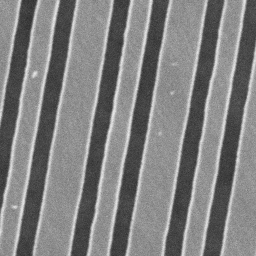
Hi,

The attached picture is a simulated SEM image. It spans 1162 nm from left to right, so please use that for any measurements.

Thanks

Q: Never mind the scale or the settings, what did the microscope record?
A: lines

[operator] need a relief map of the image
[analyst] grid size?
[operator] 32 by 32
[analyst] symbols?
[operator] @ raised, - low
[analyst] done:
@@@--@@---@@@@--@@@--@@@@@--@@@-
@@--@@@--@@@@@--@@@--@@@@@--@@@-
@@--@@@--@@@@@--@@@--@@@@---@@--
@@--@@@--@@@@@--@@@--@@@@--@@@--
@@--@@@--@@@@---@@--@@@@@--@@@--
@@--@@@--@@@@--@@@--@@@@@--@@@--
@---@@---@@@@--@@@--@@@@@--@@@--
@--@@@--@@@@@--@@@--@@@@@--@@---
@--@@@--@@@@@--@@@--@@@@@--@@---
@--@@@--@@@@@--@@---@@@@--@@@--@
@--@@@--@@@@---@@--@@@@@--@@@--@
@--@@---@@@@--@@@--@@@@@--@@@--@
---@@--@@@@@--@@@--@@@@@--@@@--@
--@@@--@@@@@--@@@--@@@@@--@@---@
--@@@--@@@@@--@@@--@@@@---@@--@@
--@@@--@@@@@--@@---@@@@--@@@--@@
--@@@--@@@@---@@--@@@@@--@@@--@@
--@@---@@@@--@@@--@@@@@--@@@--@@
--@@--@@@@@--@@@--@@@@@--@@@--@@
-@@@--@@@@@--@@@--@@@@@--@@---@@
-@@@--@@@@@--@@---@@@@---@@--@@@
-@@@--@@@@@--@@--@@@@@--@@@--@@@
-@@@--@@@@---@@--@@@@@--@@@--@@@
-@@---@@@@--@@@--@@@@@--@@@--@@@
-@@--@@@@@--@@@--@@@@@--@@@--@@@
@@@--@@@@@--@@@--@@@@@--@@---@@@
@@@--@@@@@--@@@--@@@@--@@@--@@@@
@@@--@@@@@--@@--@@@@@--@@@--@@@@
@@@--@@@@--@@@--@@@@@--@@@--@@@@
@@---@@@@--@@@--@@@@@--@@@--@@@@
@@--@@@@@--@@@--@@@@@--@@@--@@@@
@@--@@@@@--@@@--@@@@@--@@---@@@@